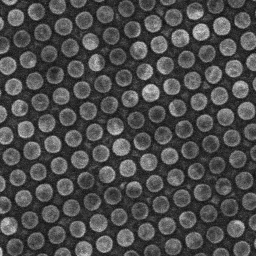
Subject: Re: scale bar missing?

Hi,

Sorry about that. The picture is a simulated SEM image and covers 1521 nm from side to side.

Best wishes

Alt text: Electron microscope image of a regular array of raised bodies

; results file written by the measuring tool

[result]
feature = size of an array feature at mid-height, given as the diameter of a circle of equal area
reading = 0.0992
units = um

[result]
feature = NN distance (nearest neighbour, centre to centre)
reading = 128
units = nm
